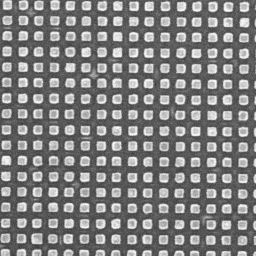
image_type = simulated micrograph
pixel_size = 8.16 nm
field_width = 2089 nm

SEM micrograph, a regular array of raised bodies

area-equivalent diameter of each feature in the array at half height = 74.8 nm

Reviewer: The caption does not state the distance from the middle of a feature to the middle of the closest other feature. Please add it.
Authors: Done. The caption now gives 0.125 microns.